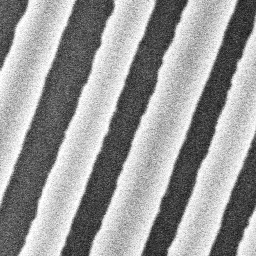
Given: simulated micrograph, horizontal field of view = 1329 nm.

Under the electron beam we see lines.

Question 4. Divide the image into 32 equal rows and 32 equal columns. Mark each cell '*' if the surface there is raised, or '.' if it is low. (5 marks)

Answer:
....*****.....*****....******...
...******.....*****....******...
...*****......****.....******...
..******.....*****....******....
..******.....*****....******...*
..*****......****....******....*
.******.....*****....******....*
.******.....****....*******...**
******......****....******....**
******.....*****....******...***
*****......****.....******...***
*****.....*****....******....***
*****.....*****....******...****
****......****....******....****
****.....*****....******....****
****.....*****....******...*****
***.....*****....******....*****
***.....*****....******....****.
***.....****....******....*****.
**.....*****....******....*****.
**.....*****....******...*****..
*.....*****....******....*****..
*.....*****....******....****...
*.....*****....******...*****...
.....*****....******....*****...
.....*****....******....****....
.....****....*******...*****....
....*****....******....*****...*
....*****....******...*****....*
...*****....******....*****....*
...*****....******....****....**
...*****...*******...*****....**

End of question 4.